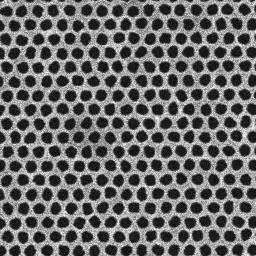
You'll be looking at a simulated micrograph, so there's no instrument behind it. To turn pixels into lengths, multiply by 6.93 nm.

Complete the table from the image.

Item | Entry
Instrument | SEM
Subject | a regular array of holes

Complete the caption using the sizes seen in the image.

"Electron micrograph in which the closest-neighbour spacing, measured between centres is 106 nanometers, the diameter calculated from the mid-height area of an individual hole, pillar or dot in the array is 81.3 nm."